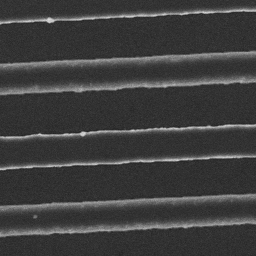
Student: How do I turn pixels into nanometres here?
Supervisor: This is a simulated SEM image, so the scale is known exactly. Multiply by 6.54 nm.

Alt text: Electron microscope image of lines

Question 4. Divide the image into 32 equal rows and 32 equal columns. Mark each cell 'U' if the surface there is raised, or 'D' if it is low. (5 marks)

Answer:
UUUUUUUUUUUUUUUUUUUUUUUUUUUUUUUU
UUUUUUUUUUUUUUUUUUUUUUUUUUUUUDDD
UUUUUUUDDDDDDDDDDDDDDDDDDDDDDDDD
DDDDDDDDDDDDDDDDDDDDDDDDDDDDDDDD
DDDDDDDDDDDDDDDDDDDDDDDDDDDDDDDD
DDDDDDDDDDDDDDDDDDDDDDDDDDDDDDDD
DDDDDDDDDDDDDDDDDDDDDDDDDDDDDDDD
DDDDDDDDDDDDDDDDDUUUUUUUUUUUUUUU
UUUUUUUUUUUUUUUUUUUUUUUUUUUUUUUU
UUUUUUUUUUUUUUUUUUUUUUUUUUUUUUUU
UUUUUUUUUUUUUUUUUUUUUUDDDDDDDDDD
UDDDDDDDDDDDDDDDDDDDDDDDDDDDDDDD
DDDDDDDDDDDDDDDDDDDDDDDDDDDDDDDD
DDDDDDDDDDDDDDDDDDDDDDDDDDDDDDDD
DDDDDDDDDDDDDDDDDDDDDDDDDDDDDDDD
DDDDDDDDDDDDDDDDDDDDDDDDDDDDDDDD
DDDDDDDDDDDDUUUUUUUUUUUUUUUUUUUU
UUUUUUUUUUUUUUUUUUUUUUUUUUUUUUUU
UUUUUUUUUUUUUUUUUUUUUUUUUUUUUUUU
UUUUUUUUUUUUUUUUUUUUUUUUUUUUUUUU
UUUUUUUUUUUUDDDDDDDDDDDDDDDDDDDD
DDDDDDDDDDDDDDDDDDDDDDDDDDDDDDDD
DDDDDDDDDDDDDDDDDDDDDDDDDDDDDDDD
DDDDDDDDDDDDDDDDDDDDDDDDDDDDDDDD
DDDDDDDDDDDDDDDDDDDDDDDDDDDDDDDD
DDDDDDDDDDDDUUUUUUUUUUUUUUUUUUUU
UUUUUUUUUUUUUUUUUUUUUUUUUUUUUUUU
UUUUUUUUUUUUUUUUUUUUUUUUUUUUUUUU
UUUUUUUUUUUUUUUUUDDDDDDDDDDDDDDD
DDDDDDDDDDDDDDDDDDDDDDDDDDDDDDDD
DDDDDDDDDDDDDDDDDDDDDDDDDDDDDDDD
DDDDDDDDDDDDDDDDDDDDDDDDDDDDDDDD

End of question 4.